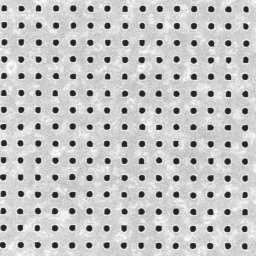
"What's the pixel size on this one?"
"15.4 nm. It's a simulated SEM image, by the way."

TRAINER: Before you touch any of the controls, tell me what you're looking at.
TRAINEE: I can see a regular array of holes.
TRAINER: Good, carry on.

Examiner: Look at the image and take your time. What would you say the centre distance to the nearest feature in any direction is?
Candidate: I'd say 258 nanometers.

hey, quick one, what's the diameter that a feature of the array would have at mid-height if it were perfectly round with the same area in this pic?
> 107 nm